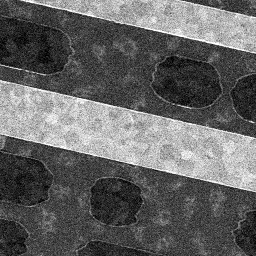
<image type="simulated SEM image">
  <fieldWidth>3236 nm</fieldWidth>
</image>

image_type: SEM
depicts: one or a few lines or trenches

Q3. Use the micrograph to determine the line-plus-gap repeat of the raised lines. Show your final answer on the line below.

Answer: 815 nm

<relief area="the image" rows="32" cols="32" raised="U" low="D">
DDDDDUUUUUUUUUUUUUUUUUUUDDDDDDDD
DDDDDDDDDUUUUUUUUUUUUUUUUUUUUDDD
UUUDDDDDDDDDDDUUUUUUUUUUUUUUUUUU
UUUUUUUDDDDDDDDDDDUUUUUUUUUUUUUU
UUUUUUUUDDDDDDDDDDDDDDUUUUUUUUUU
UUUUUUUUUDDDDDDUDDDDDDDDDDDUUUUU
UUUUUUUUUDDDUDDDDDDDDDDDDDDDDDDU
UUUUUUUUUDDDDDDDDDDDDUUUUDDDDDDD
DDUUUUUUDDDDDDDDDDDUUUUUUUUDDDDD
DDDDDDDDDDDDDDDDDDDUUUUUUUUDDDDU
UUDUDDDDDDDDDDDDDDDUUUUUUUUUDUUU
UUUUUUUDDDDDDDDDDDDUUUUUUUUUDUUU
UUUUUUUUUUUDDDDDDDDDUUUUUUUDDUUU
UUUUUUUUUUUUUUUDDDDDDDDDUDDDDUUU
UUUUUUUUUUUUUUUUUUUDDDDDDDDDDDUU
UUUUUUUUUUUUUUUUUUUUUUUUDDDDDDDD
UUUUUUUUUUUUUUUUUUUUUUUUUUUUDDDD
UDDUUUUUUUUUUUUUUUUUUUUUUUUUUUUU
DDDDDDDDUUUUUUUUUUUUUUUUUUUUUUUU
UUUDDDDDDDDDUUUUUUUUUUUUUUUUUUUU
UUUUUDDDDDDDDDDDUUUUUUUUUUUUUUUU
UUUUUUDDDDDDDDDDDDDDDUUUUUUUUUUU
UUUUUUUDDDDDUUUUDDDDDDDDDDUUUUUU
UUUUUUDDDDDUUUUUUUDDDDDDDDDDDDUU
UUUUUUDDDDDUUUUUUUDDDDDDDDDDDDDD
DDUUUDDDDDDUUUUUUUDDDDDDDDDDDDDD
DDDDDDDDDDDUUUUUUDDDDDDDDDDUDDDU
UDDDDDDDDDDDUUUUUDDDDDDDDDDDDDUU
UUUDDDDDDDDDDDDDDDDDDDDDDDDDDDUU
UUUUDDDDDDDDDDDDDDDDDDDDDDDDDUUU
UUUDDDDDDDDUUUUDDDDDDDDDDDDDDDUU
UUUDDDDDDDUUUUUUUUUDDDDDDDDDDDUU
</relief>